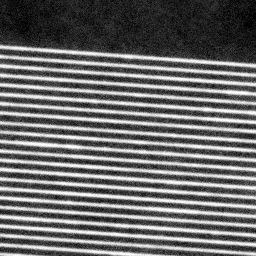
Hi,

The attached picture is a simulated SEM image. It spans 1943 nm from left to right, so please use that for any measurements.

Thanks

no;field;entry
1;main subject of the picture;parallel lines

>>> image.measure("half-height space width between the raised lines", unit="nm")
61.5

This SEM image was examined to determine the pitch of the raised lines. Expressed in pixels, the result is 9.37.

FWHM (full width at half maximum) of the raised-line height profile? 1 pixels